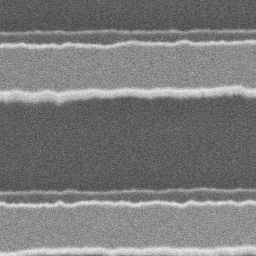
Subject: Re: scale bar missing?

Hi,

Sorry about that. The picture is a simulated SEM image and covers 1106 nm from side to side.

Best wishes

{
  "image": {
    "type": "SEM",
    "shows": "lines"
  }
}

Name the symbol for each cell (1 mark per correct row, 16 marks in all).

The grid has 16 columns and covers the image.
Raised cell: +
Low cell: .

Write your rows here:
................
................
................
++++++++++++++++
++++++++++++++++
++++++++++++++++
................
................
................
................
................
................
................
++++++++++++++++
++++++++++++++++
++++++++++++++++